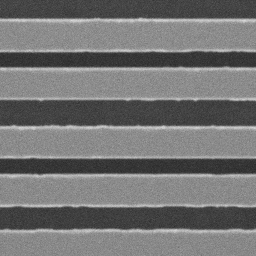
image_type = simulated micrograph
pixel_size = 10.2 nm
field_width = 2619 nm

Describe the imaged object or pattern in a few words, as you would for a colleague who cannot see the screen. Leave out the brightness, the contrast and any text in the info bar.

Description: lines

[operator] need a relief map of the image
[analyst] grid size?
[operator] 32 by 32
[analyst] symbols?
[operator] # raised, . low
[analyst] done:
................................
................................
################################
################################
################################
################################
................................
................................
......................#.....#...
################################
################################
################################
.....#.........##.##..#.#...####
................................
................................
................................
################################
################################
################################
################################
................................
................................
################################
################################
################################
################################
................................
................................
................................
################################
################################
################################